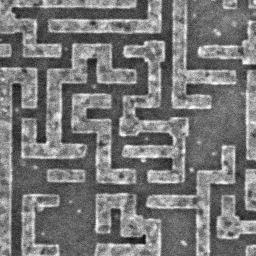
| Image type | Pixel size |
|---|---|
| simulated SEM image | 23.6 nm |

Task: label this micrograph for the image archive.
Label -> wiring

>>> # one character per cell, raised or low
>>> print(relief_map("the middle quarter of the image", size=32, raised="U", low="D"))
DDUUUDDDUUUUDDDDDDDDDUUUDDDUUUDD
UUUUUDDDUUUUUUUUDDDDDUUUDDDUUUUD
UUUUUDDDUUUUUUUUUUDDDUUUDDDUUUUU
UUUUUDDDUUUUUUUUUUDDDUUUDDDUUUUU
UUUUUDDDDUUUUUUUUUDDDUUUDDDUUUUU
DDDDDDDDDDDDDDDDDDDDDUUUDDDUUUDD
DDDDDDDDDDDDDDDDDDDDDUUUDDDUUUDD
DDDDDDDDDDDDDDDDDDDDDUUUDDDUUUDD
DDUUUUUUUUUUDDDUUUUUUUUUDDDUUUUU
DDUUUUUUUUUUDDDUUUUUUUUUDDDUUUUU
DDUUUUUUUUUUDDDUUUUUUUUUDDDUUUUU
DDUUUDDDDDDDDDDUUUDDDDDDDDDDDDDD
DDUUUDDDDDDDDDDUUUDDDDDDDDDDDDDD
DDUUUUDDDDDDDDUUUUDDDDDDDDDDDDDD
DDUUUUUUUUUUDDUUUUUUUUUUDDUUUUUD
DDUUUUUUUUUUDDUUUUUUUUUUUUUUUUUD
DDUUUUUUUUUUDDUUUUUUUUUUUUUUUUUD
DDDDDDDDUUUUDDUUUUDDDDDDDDDUUUUD
DDDDDDDDUUUUDDDDDDDDDDDDDDDUUUDD
DDDDDDDDUUUUDDDDDDDDDDDDDDDUUUDD
UUUUUDDDUUUDDDDDDDDDDDDDDDDUUUDD
UUUUUDDDUUUDDDDUUUUUUUUUUUUUUUDD
UUUUUDDDUUUDDDDUUUUUUUUUUUUUUUDD
DDDDDDDDUUUDDDDDDDDDDDDDDDDUUUDD
DDDDDDDDUUUDDDDDDDDDDDDDDDDUUUDD
DDDDDDDDUUUDDDDDDDDDDDDDDDDUUUDD
DDDDDDDDUUUUDDDDDDDDDDDDDDDUUUDD
UUUUUDDDUUUUUUUUUUDDDUUUUUUUUUDD
UUUUUDDDUUUUUUUUUUDDDUUUUUUUUUDD
DDDDDDDDDUUUUUUUUUDDDDDDDDDDDDDD
DDDDDDDDDDDDDDDDDDDDDDDDDDDDDDDD
DDDDDDDDDDDDDDDDDDDDDDDDDDDDDDDD